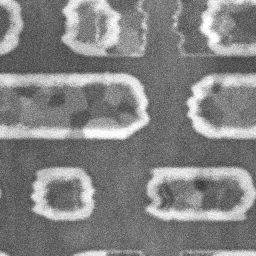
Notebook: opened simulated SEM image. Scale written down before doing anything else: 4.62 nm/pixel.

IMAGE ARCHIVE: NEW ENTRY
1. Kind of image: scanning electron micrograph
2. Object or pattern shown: one or a few lines or trenches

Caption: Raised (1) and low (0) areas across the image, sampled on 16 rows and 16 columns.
1000111000000111
1000111000000111
1000111000000111
0000000000000000
0000000000000000
1111111100000111
1111111110001111
1111111110001111
0000000000000000
0000000000000000
0000000000000000
0011100000111111
0011100000111111
0000000000000000
0000000000000000
0000000000000000